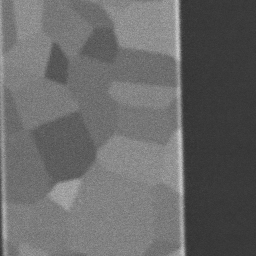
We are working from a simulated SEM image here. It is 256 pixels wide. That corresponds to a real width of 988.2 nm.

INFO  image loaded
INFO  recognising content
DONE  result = one or a few lines or trenches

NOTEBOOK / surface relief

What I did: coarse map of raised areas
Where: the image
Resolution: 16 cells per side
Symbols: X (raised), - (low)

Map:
XXXXXXXXXXX-----
XXXXXXXXXXX-----
XXXXXXXXXXX-----
XXXXXXXXXXX-----
XXXXXXXXXXX-----
XXXXXXXXXXX-----
XXXXXXXXXXX-----
XXXXXXXXXXX-----
XXXXXXXXXXX-----
XXXXXXXXXXX-----
XXXXXXXXXXX-----
XXXXXXXXXXX-----
XXXXXXXXXXX-----
XXXXXXXXXXX-----
XXXXXXXXXXX-----
XXXXXXXXXXX-----